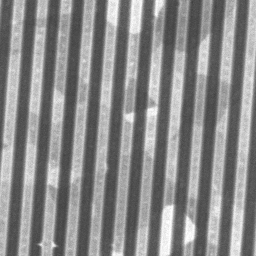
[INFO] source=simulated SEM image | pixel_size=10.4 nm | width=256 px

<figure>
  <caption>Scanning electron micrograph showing parallel lines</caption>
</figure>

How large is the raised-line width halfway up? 0.119 µm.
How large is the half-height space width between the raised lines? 128 nm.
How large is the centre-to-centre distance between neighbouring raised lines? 0.244 microns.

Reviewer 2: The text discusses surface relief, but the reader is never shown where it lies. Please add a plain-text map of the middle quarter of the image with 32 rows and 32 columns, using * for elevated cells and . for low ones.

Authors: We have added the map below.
*...**....**....**....**...***..
*...***...**....**....**...***..
*...***...**....**....**...***..
....**....**....**...***...***..
...***...***...***...***...***..
...***...***...***...***...***..
...***...***...***...***...***..
...***...***...***...***...***..
...***...***...***...***...***..
...***...***...***...**....**...
...***...***...***...**....**...
...***...***...***...**....**...
...***...***...***...**....**...
...**....**....**....**...***...
...**....**....**....**...***...
...**....**....**....**...***...
...**....**....**...***...***...
..***...***...***...***...***...
..***...***...***...***...***...
..***...***...***...***...***...
..***...***...***...***...***...
..***...***...***...***...***...
..***...***...***...**....**....
..***...***...***...**....**....
..***...***...***...**....**....
..***...***...***...**....**....
..**....***...**....**...***...*
..**....**....**...***...***...*
..**....**....**...***...***...*
..**....**....**...***...***...*
.***...***...***...***...***...*
.***...***...***...***...***...*